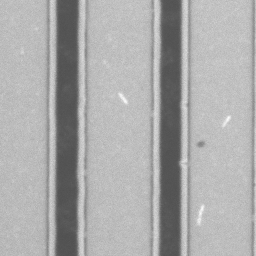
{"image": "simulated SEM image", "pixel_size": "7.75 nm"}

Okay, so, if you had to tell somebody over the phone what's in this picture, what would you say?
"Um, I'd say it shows one or a few lines or trenches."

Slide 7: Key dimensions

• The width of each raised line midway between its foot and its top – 0.234 micrometres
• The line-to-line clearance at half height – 566 nm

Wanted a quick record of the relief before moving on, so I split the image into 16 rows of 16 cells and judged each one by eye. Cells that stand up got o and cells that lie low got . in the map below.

...oo.....oo....
...oo.....oo....
...oo.....oo....
...oo.....oo....
...oo.....oo....
...oo.....oo....
...oo.....oo....
...oo.....oo....
...oo.....oo....
...oo.....oo....
...oo.....oo....
...oo.....oo....
...oo.....oo....
...oo.....oo....
...oo.....oo....
...oo.....oo....